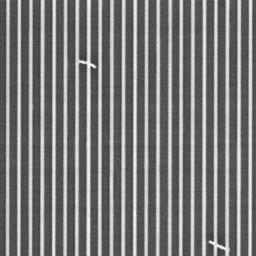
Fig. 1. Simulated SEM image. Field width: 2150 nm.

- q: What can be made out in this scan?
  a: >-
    parallel lines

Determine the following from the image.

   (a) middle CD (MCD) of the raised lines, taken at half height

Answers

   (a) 24.1 nm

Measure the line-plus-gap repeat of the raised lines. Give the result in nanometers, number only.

97.1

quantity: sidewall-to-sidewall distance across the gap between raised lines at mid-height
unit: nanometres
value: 74.5